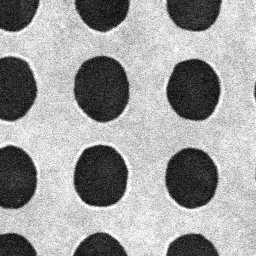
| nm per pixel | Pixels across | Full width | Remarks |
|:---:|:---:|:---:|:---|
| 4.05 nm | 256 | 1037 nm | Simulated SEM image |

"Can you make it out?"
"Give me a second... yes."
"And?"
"holes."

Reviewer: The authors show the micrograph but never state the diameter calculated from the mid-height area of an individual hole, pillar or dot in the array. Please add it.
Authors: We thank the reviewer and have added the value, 236 nanometers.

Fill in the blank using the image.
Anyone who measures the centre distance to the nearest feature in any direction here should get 356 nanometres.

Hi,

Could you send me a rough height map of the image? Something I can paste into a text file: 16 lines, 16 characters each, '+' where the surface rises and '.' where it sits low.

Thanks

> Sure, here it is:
..+++...++....++
..+++..++++..+++
++++++++++++++++
++++++++++++++++
..+++...+++..+++
..+++...++....++
..+++...+++...++
.+++++.+++++.+++
++++++++++++++++
..+++..++++..+++
..+++...++....++
..+++...++....++
..+++..++++..+++
++++++++++++++++
++++++++++++++++
..+++...+++..+++